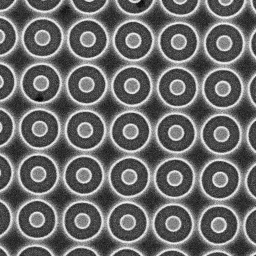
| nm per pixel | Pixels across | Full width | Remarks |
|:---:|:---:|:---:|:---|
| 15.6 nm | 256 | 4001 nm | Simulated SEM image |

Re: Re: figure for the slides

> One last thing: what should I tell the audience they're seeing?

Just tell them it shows an array of small figures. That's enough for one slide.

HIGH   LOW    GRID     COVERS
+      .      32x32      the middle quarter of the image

++++...+++++++++++++++++++++++++
+++......+++++......++++++.....+
++........+++........++++.......
+....+....+++........+++........
+...+++...++....++....++...++...
+...+++....+...++++...+....+++..
+...+++...++...++++...++...+++..
+.........+++........+++....+...
++.......++++........+++........
+++.....++++++......+++++.......
+++++++++++++++++++++++++++...++
++++++++++++++++++++++++++++++++
+++.....++++++.....++++++++..+++
+........++++.......+++++......+
+.........++.........+++........
+...+++...++...+++...++....+....
...++++...++...+++....+...++++..
+...+++...++...+++....+...++++..
+.........++....+....++....++...
+........++++........+++........
+++.....+++++.......+++++.......
+++++++++++++++...++++++++.....+
++++++++++++++++++++++++++++++++
+++....++++++++..+++++++++++++++
+........++++......++++++.....++
+........+++........++++.......+
....++....++....+....++.........
...++++...++...+++...++...+++...
...++++...+....+++...++...+++...
....++...+++...+++...++...+++...
+........+++.........++.........
++......+++++.......++++........